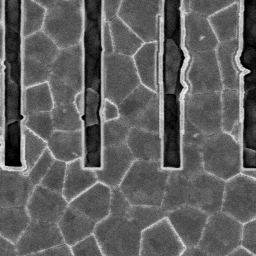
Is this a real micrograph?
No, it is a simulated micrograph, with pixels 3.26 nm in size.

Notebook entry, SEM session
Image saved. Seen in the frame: one or a few lines or trenches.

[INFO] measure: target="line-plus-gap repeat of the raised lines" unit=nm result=260